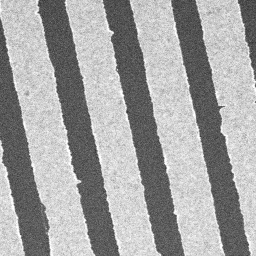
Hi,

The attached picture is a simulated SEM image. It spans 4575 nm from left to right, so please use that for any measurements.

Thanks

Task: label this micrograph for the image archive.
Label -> one or a few lines or trenches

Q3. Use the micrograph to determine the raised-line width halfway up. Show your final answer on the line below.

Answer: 37.9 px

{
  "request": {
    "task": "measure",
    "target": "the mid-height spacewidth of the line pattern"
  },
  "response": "483 nm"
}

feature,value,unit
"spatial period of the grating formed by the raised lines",1160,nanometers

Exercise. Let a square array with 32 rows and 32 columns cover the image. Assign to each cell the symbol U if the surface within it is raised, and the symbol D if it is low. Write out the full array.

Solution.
UUUUUDDDUUUUUDDDUUUUUDDDDUUUUUDD
UUUUUDDDUUUUUDDDDUUUUUDDDUUUUUDD
UUUUUDDDDUUUUDDDDUUUUUDDDUUUUUDD
UUUUUDDDDUUUUUDDDUUUUUDDDUUUUUDD
DUUUUUDDDUUUUUDDDUUUUUDDDUUUUUUD
DUUUUUDDDUUUUUDDDDUUUUDDDDUUUUUD
DUUUUUDDDDUUUUDDDDUUUUUDDDUUUUUD
DUUUUUDDDDUUUUDDDDUUUUUDDDUUUUUD
DDUUUUUDDDUUUUDDDDUUUUUDDDUUUUUD
DDUUUUUDDDUUUUUDDDUUUUUDDDDUUUUU
DDUUUUUDDDDUUUUDDDDUUUUDDDDUUUUU
DDUUUUUDDDDUUUUDDDDUUUUUDDDUUUUU
DDUUUUUDDDDUUUUUDDDUUUUUDDDUUUUU
DDDUUUUUDDDUUUUUDDDUUUUUDDDDUUUU
DDDUUUUUDDDUUUUUDDDUUUUUDDDDUUUU
DDDUUUUUDDDUUUUUDDDDUUUUUDDDUUUU
DDDUUUUUDDDDUUUUDDDDUUUUUDDDUUUU
DDDUUUUUDDDDUUUUUDDDUUUUUDDDUUUU
DDDDUUUUUDDDUUUUUDDDUUUUUDDDUUUU
DDDDUUUUUDDDUUUUUDDDDUUUUDDDDUUU
DDDDUUUUUDDDDUUUUDDDDUUUUUDDDUUU
UDDDUUUUUDDDDUUUUDDDDUUUUUDDDUUU
UDDDUUUUUUDDDUUUUUDDDUUUUUDDDUUU
UDDDDUUUUUDDDUUUUUDDDUUUUUDDDDUU
UDDDDUUUUUDDDUUUUUDDDDUUUUDDDDUU
UUDDDUUUUUDDDDUUUUDDDDUUUUUDDDUU
UUDDDDUUUUDDDDUUUUDDDDUUUUUDDDUU
UUDDDDUUUUUDDDUUUUUDDDUUUUUDDDDU
UUDDDDUUUUUDDDUUUUUDDDUUUUUDDDDU
UUDDDDUUUUUDDDUUUUUDDDDUUUUDDDDU
UUUDDDUUUUUDDDDUUUUDDDDUUUUUDDDU
UUUDDDUUUUUUDDDUUUUUDDDUUUUUDDDU